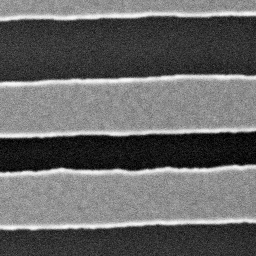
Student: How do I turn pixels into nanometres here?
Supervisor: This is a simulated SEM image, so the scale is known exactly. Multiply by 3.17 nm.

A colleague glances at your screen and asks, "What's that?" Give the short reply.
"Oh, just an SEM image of lines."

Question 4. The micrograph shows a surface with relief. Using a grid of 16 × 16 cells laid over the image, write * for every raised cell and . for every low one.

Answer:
****************
................
................
................
................
****************
****************
****************
***.............
................
..........*..***
****************
****************
****************
................
................